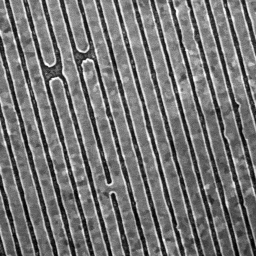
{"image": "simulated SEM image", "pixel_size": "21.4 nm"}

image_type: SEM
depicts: parallel lines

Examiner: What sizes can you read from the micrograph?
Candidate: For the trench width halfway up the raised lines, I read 119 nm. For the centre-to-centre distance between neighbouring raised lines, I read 375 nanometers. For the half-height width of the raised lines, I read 12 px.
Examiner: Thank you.